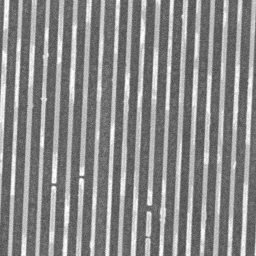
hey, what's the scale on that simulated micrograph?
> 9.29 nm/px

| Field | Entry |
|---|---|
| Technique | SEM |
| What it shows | parallel lines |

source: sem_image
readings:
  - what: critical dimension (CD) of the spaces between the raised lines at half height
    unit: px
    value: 9.36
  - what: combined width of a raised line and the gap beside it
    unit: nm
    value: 127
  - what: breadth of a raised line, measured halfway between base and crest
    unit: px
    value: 4.75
